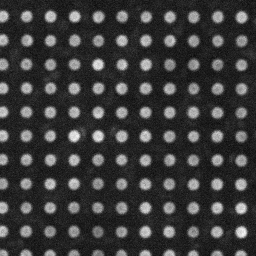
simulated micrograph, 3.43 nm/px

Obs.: a regular array of raised bodies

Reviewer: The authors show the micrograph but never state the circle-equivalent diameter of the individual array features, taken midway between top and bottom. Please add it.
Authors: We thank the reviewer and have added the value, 11 pixels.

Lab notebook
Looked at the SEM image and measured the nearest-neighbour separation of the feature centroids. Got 81.2 nm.